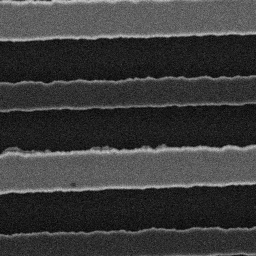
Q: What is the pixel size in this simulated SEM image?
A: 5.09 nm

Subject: lines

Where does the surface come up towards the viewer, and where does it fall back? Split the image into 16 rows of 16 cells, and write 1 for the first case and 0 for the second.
1111111111111111
1111111111111111
1110000000000000
0000000000000000
0000000000000000
1111111111111111
1111111111111111
0000000000000000
0000000000000000
0001111111111111
1111111111111111
1111111111111111
0000000000000000
0000000000000000
0000001111111111
1111111111111111